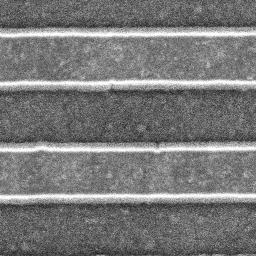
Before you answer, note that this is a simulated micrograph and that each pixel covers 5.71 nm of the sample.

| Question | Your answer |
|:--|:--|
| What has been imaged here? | one or a few lines or trenches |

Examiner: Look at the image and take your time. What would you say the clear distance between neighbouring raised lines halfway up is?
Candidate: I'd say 0.383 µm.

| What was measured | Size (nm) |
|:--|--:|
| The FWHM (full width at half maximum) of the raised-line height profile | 272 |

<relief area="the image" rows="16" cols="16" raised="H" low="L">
LLLLLLLLLLLLLLLL
LLLLLLLLLLLLLLLL
HHHHHHHHHHHHHHHH
HHHHHHHHHHHHHHHH
HHHHHHHHHHHHHHHH
LLLLLLLLLLLLLLLL
LLLLLLLLLLLLLLLL
LLLLLLLLLLLLLLLL
LLLLLLLLLLLLLLLL
HHHHHHHHHHHHHHHH
HHHHHHHHHHHHHHHH
HHHHHHHHHHHHHHHH
LLLLLLLLLLLLLLLL
LLLLLLLLLLLLLLLL
LLLLLLLLLLLLLLLL
LLLLLLLLLLLLLLLL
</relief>